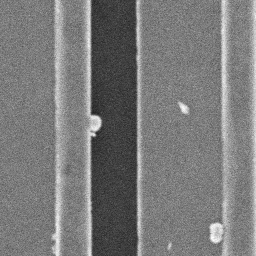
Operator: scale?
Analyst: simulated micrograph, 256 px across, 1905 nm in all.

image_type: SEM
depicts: lines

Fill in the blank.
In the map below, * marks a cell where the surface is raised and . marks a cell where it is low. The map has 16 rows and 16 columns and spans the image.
******...*******
******...*******
******...*******
******...*******
******...*******
******...*******
******...*******
******...*******
******...*******
******...*******
******...*******
******...*******
******...*******
******...*******
******...*******
******...*******